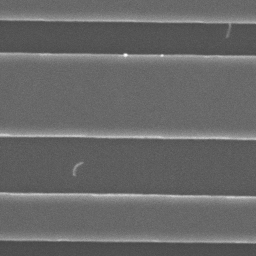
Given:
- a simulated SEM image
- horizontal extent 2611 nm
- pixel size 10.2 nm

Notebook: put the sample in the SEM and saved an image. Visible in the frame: lines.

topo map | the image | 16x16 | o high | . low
oooooooooooooooo
................
................
oooooooo..o.....
oooooooooooooooo
oooooooooooooooo
oooooooooooooooo
oooooooooooooooo
.....ooooooooooo
................
................
................
oooooooooooooooo
oooooooooooooooo
oooooooooooooooo
................